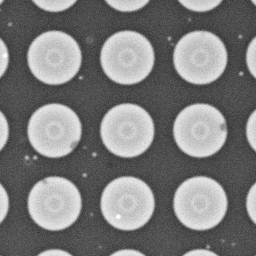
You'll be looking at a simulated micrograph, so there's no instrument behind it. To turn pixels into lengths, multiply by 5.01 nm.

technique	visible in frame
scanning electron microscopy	an array of small figures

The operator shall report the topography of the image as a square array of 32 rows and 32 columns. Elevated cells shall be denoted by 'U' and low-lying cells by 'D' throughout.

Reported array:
DDDDDUUUUDDDDDUUUUDDDDDUUUUDDDDD
DDDDDDDDDDDDDDDDDDDDDDDDDDDDDDDD
DDDDDDDDDDDDDDDDDDDDDDDDDDDDDDDD
DDDDDDDDDDDDDDDDDDDDDDDDDDDDDDDD
DDDDDUUUUDDDDDUUUUDDDDDUUUUDDDDD
UDDDUUUUUUDDDUUUUUUDDDUUUUUUDDDU
UDDDUUUUUUDDDUUUUUUDDDUUUUUUDDDU
UDDDUUUUUUDDDUUUUUUDDDUUUUUUDDDU
UDDDUUUUUUDDDUUUUUUDDDUUUUUUDDDU
DDDDUUUUUDDDDUUUUUDDDDDUUUUDDDDD
DDDDDDDDDDDDDDDDDDDDDDDDDDDDDDDD
DDDDDDDDDDDDDDDDDDDDDDDDDDDDDDDD
DDDDDDDDDDDDDDDDDDDDDDDDDDDDDDDD
DDDDDUUUUDDDDDUUUUDDDDDUUUUDDDDD
DDDDUUUUUUDDDUUUUUUDDDUUUUUUDDDU
UDDDUUUUUUDDDUUUUUUDDDUUUUUUDDDU
UDDDUUUUUUDDDUUUUUUDDDUUUUUUDDDU
UDDDUUUUUUDDDUUUUUUDDDUUUUUUDDDU
DDDDUUUUUDDDDUUUUUDDDDDUUUUUDDDD
DDDDDDUUDDDDDDDUUDDDDDDDUUDDDDDD
DDDDDDDDDDDDDDDDDDDDDDDDDDDDDDDD
DDDDDDDDDDDDDDDDDDDDDDDDDDDDDDDD
DDDDDUUUDDDDDDUUUDDDDDDUUUUDDDDD
DDDDUUUUUUDDDUUUUUUDDDUUUUUUDDDU
UDDDUUUUUUDDDUUUUUUDDDUUUUUUDDDU
UDDDUUUUUUDDDUUUUUUDDDUUUUUUDDDU
UDDDUUUUUUDDDUUUUUUDDDUUUUUUDDDU
DDDDUUUUUDDDDUUUUUUDDDUUUUUUDDDD
DDDDDDUUDDDDDDDUUDDDDDDDUUDDDDDD
DDDDDDDDDDDDDDDDDDDDDDDDDDDDDDDD
DDDDDDDDDDDDDDDDDDDDDDDDDDDDDDDD
DDDDDDUUDDDDDDDUUDDDDDDDUUDDDDDD